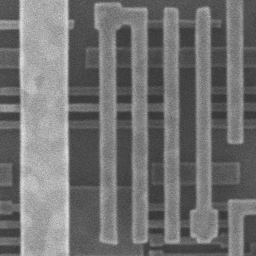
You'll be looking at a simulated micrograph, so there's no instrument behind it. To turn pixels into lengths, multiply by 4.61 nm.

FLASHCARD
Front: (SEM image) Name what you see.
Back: wiring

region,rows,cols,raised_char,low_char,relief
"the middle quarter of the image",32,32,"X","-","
X--------XXXX----XXXX----XXXX---
X--------XXXX----XXXX----XXXX---
X--------XXXX----XXXX----XXXX---
X--------XXXX----XXXX----XXXX---
X--------XXXX----XXXX----XXXX---
X--------XXXX----XXXX----XXXX---
X--------XXXX----XXXX----XXXX---
X--------XXXX----XXXX----XXXX---
X--------XXXX----XXXX----XXXX---
X--------XXXX----XXXX----XXXX---
X--------XXXX----XXXX----XXXX---
X--------XXXX----XXXX----XXXX---
X--------XXXX----XXXX----XXXX---
X--------XXXX----XXXX----XXXX---
X--------XXXX----XXXX----XXXX---
X--------XXXX----XXXX----XXXX---
X--------XXXX----XXXX----XXXX---
X--------XXXX----XXXX----XXXX---
X--------XXXX----XXXX----XXXX---
X--------XXXX----XXXX----XXXX---
X--------XXXX----XXXX----XXXX---
X--------XXXX----XXXX----XXXX---
X--------XXXX----XXXX----XXXX---
X--------XXXX----XXXX----XXXX---
X--------XXXX----XXXX----XXXX---
X--------XXXX----XXXX----XXXX---
X--------XXXX----XXXX----XXXX---
X--------XXXX----XXXX----XXXX---
X--------XXXX----XXXX----XXXX---
X--------XXXX----XXXX----XXXX---
X--------XXXX----XXXX----XXXX---
X--------XXXX----XXXX----XXXX---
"